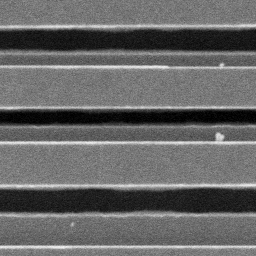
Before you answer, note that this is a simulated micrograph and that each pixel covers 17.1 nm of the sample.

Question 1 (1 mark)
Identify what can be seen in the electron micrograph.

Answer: lines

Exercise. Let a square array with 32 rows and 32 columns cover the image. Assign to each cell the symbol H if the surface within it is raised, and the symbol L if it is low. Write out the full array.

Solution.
HHHHHHHHHHHHHHHHHHHHHHHHHHHHHHHH
HHHHHHHHHHHHHHHHHHHHHHHHHHHHHHHH
HHHHHHHHHHHHHHHHHHHHHHHHHHHHHHHH
LLLLLLLLLLLLLLLLLLLLLLLLLLLLLLLL
LLLLLLLLLLLLLLLLLLLLLLLLLLLLLLLL
LLLLLLLLLLLLLLLLLLLLLLLLLLLLLLLL
LLLLLLLLLLLLLLLLLLLLLLLLLLLLLLLL
HHHHHHHHHHHHHHHHHHHHHHHHHHHHHHHH
HHHHHHHHHHHHHHHHHHHHHHHHHHHHHHHH
HHHHHHHHHHHHHHHHHHHHHHHHHHHHHHHH
HHHHHHHHHHHHHHHHHHHHHHHHHHHHHHHH
HHHHHHHHHHHHHHHHHHHHHHHHHHHHHHHH
HHHHHHHHHHHHHHHHHHHHHHHHHHHHHHHH
HHHLLLLLLLLLLLLLLLLLLLLLLLLLLLLL
LLLLLLLLLLLLLLLLLLLLLLLLLLLLLLLL
LLLLLLLLLLLLLLLLLLLLLLLLLLLLLLLL
HHHHHHHHHHHHHHHHHHHHHHHHHHHHHHHH
HHHHHHHHHHHHHHHHHHHHHHHHHHHHHHHH
HHHHHHHHHHHHHHHHHHHHHHHHHHHHHHHH
HHHHHHHHHHHHHHHHHHHHHHHHHHHHHHHH
HHHHHHHHHHHHHHHHHHHHHHHHHHHHHHHH
HHHHHHHHHHHHHHHHHHHHHHHHHHHHHHHH
HHHHHHHHHHHHHHHHHHHHHHHHHHHHHHHH
LLLLLLLLLLLLLLLLLLLLLLLLLLLLLLLL
LLLLLLLLLLLLLLLLLLLLLLLLLLLLLLLL
LLLLLLLLLLLLLLLLLLLLLLLLLLLLLLLL
LLLLLLLLLLLLLLLLLLLLLLLLLLLLLLLL
HHHHHHHHHHHHHHHHHHHHHHHHHHHHHHHH
HHHHHHHHHHHHHHHHHHHHHHHHHHHHHHHH
HHHHHHHHHHHHHHHHHHHHHHHHHHHHHHHH
HHHHHHHHHHHHHHHHHHHHHHHHHHHHHHHH
HHHHHHHHHHHHHHHHHHHHHHHHHHHHHHHH